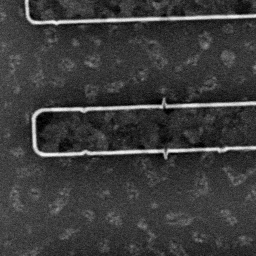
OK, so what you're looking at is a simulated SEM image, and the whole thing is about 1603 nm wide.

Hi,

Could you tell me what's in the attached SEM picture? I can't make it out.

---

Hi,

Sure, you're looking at one or a few lines or trenches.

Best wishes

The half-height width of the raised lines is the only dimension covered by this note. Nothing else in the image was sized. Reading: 0.279 micrometres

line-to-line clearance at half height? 546 nm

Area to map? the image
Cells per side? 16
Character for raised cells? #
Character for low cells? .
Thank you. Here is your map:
..##############
................
................
................
................
................
...............#
..##############
..##############
...####...#.....
................
................
................
................
................
................